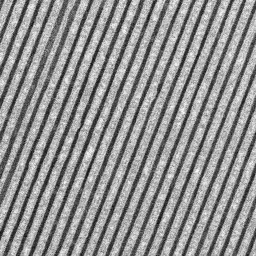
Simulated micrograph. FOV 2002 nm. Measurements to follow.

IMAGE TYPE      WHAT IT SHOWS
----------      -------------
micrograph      parallel lines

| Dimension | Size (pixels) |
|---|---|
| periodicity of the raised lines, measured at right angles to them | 11.9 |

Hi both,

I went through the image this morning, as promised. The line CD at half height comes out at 59.2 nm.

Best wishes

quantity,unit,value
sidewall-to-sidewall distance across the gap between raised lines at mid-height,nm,33.7